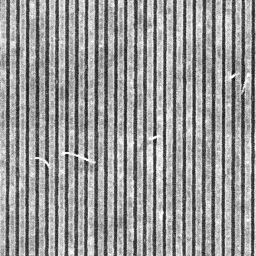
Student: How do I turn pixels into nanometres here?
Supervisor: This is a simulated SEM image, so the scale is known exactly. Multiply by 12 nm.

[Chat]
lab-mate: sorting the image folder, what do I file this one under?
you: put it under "parallel lines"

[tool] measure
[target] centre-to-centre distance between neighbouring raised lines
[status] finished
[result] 0.117 microns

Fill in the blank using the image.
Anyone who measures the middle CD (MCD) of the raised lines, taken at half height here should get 5.25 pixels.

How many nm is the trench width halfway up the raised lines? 52.4